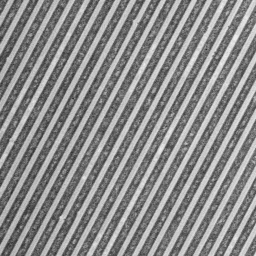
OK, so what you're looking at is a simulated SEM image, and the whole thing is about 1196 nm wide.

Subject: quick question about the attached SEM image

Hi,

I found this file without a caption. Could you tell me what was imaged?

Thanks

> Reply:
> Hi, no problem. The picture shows parallel lines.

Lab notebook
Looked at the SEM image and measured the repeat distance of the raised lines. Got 0.063 um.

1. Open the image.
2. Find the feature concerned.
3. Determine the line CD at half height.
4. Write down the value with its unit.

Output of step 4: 4.86 px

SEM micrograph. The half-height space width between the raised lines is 40.7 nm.